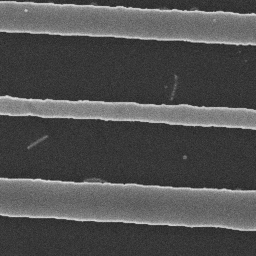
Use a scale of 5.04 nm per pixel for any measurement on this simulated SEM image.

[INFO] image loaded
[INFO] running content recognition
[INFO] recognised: lines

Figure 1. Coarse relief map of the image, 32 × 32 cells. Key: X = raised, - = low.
XXXXXXX-------------------------
XXXXXXXXXXXXXXXXXXXXXXXXXX-X----
XXXXXXXXXXXXXXXXXXXXXXXXXXXXXXXX
XXXXXXXXXXXXXXXXXXXXXXXXXXXXXXXX
-----------XXXXXXXXXXXXXXXXXXXXX
-----------------------------XXX
--------------------------------
--------------------------------
--------------------------------
--------------------------------
--------------------------------
--------------------------------
XXXXXXX-------------------------
XXXXXXXXXXXXXXXXXXXXXXXXXXXXX---
----XXXXXXXXXXXXXXXXXXXXXXXXXXXX
---------------------XXXXXXXXXXX
--------------------------------
--------------------------------
--------------------------------
--------------------------------
--------------------------------
--------------------------------
XXXXX---------------------------
XXXXXXXXXXXXXXXXXXXXXX----------
XXXXXXXXXXXXXXXXXXXXXXXXXXXXXXXX
XXXXXXXXXXXXXXXXXXXXXXXXXXXXXXXX
XXXXXXXXXXXXXXXXXXXXXXXXXXXXXXXX
---------XXXXXXXXXXXXXXXXXXXXXXX
----------------------------XXXX
--------------------------------
--------------------------------
--------------------------------